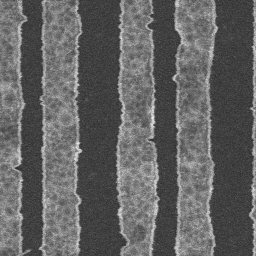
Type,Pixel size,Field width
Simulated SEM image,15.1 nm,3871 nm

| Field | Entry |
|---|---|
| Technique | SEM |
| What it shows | one or a few lines or trenches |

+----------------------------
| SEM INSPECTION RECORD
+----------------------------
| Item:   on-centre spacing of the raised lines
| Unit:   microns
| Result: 1.01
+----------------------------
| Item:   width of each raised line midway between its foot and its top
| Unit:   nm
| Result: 488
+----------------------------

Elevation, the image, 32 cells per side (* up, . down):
***..*****.....****...*****.....
***...****.....****...*****.....
***...****.....****...*****.....
**...*****.....****...*****.....
**...*****.....****....****.....
**....****.....****....***......
**...*****.....*.**...****......
**....***......****...****......
**....***......****...****......
**....***......****...****......
**...****......****...****......
***...***......****...****......
***..****......****...****......
***...***......****...****......
***...****.....****...****......
**....****.....****...****......
**....****.....****...****......
***...****.....****...****......
**...*****.....****...****......
**...****......****...****......
**....***......****...*****.....
**....***......****...****......
***...***......****...****......
**....***......****....***......
***...****.....*****...***......
**....****.....****...****......
**....****.....****...****......
***...****.....****...****......
***...****.....****...****......
***...****......***...****......
**...*****......***...*****.....
***..*****.....****...****......